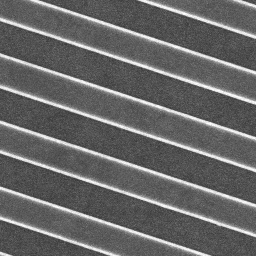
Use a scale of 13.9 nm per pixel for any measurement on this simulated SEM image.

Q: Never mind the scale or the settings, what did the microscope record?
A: one or a few lines or trenches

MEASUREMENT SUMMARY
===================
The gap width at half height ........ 0.469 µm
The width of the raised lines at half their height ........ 0.409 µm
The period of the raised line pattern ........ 879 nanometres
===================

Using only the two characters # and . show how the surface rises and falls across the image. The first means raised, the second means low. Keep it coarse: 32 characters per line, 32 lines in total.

######.............############.
#########.............##########
############.............#######
...############.............####
......############..............
.........############...........
............############........
##.............############.....
#####.............############..
########..............##########
###########..............#######
..############..............####
.....############..............#
........############............
...........############.........
#.............############......
####.............############...
#######.............############
##########.............#########
..###########.............######
.....###########.............###
........###########.............
...........###########..........
..............###########.......
###..............###########....
######..............###########.
#########..............#########
.###########..............######
....###########..............###
.......###########..............
..........###########...........
.............###########........